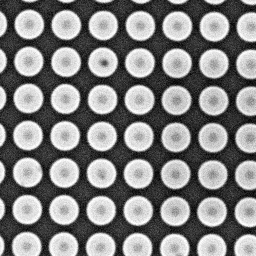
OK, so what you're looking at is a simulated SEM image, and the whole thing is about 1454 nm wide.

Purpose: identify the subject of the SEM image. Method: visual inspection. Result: an array of small figures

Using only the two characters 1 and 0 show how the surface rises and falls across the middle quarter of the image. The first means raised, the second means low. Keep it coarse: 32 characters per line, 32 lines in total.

11110011111110001111110001111111
11100001111110001111110001111110
11000000111100000111100000111110
00000000000000000000000000000000
00000000000000000000000000000000
11000000111000000011000000000000
11100001111100001111100000111100
11110011111110001111110001111110
11110011111110011111110001111111
11110011111110011111110001111111
11100011111110001111110001111110
11100001111100001111100001111110
00000000000000000000000000011000
00000000000000000000000000000000
00000000000000000000000000000000
11100001111100001111100000111100
11110011111110001111110001111110
11110011111110011111110001111110
11110011111110011111110001111110
11100011111110011111110001111110
11100001111100001111100001111110
00000000010000000011000000111100
00000000000000000000000000000000
00000000000000000000000000000000
11000001111000000111100000111100
11100011111100001111110001111110
11110011111110011111110001111110
11110011111110011111110011111110
11100011111110011111110001111110
11100001111100001111100001111110
10000000111000000111000000111100
00000000000000000000000000000000